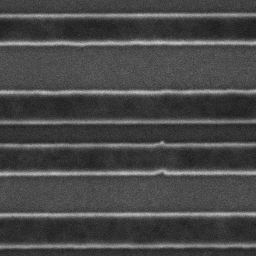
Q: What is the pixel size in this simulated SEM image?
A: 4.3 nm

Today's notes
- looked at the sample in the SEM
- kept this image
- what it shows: one or a few lines or trenches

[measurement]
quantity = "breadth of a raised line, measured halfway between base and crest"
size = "0.134 µm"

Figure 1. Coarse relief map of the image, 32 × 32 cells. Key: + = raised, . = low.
................................
................................
++++++++++++++++++++++++++++++++
++++++++++++++++++++++++++++++++
++++++++++++++++++++++++++++++++
+++++++..++.....................
................................
................................
................................
................................
................................
++++++.+++++++......++++++++++++
++++++++++++++++++++++++++++++++
++++++++++++++++++++++++++++++++
++++++++++++++++++++++++++++++++
................................
................................
................................
++++++++++++++++++++++++++++++++
++++++++++++++++++++++++++++++++
++++++++++++++++++++++++++++++++
++++++++++++++++++++++++++++++++
................................
................................
................................
................................
................................
++++++++++++++++++++++++++++++++
++++++++++++++++++++++++++++++++
++++++++++++++++++++++++++++++++
++++++++++++++++++++++++++++++++
................................